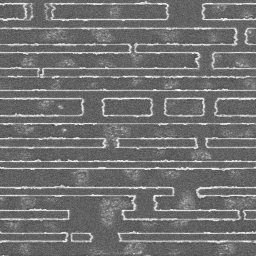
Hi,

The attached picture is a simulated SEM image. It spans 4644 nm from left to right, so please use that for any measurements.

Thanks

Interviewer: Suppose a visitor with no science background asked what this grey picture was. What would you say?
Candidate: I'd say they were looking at parallel lines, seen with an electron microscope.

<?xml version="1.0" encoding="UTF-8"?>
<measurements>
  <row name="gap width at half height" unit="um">0.261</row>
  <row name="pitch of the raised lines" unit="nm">430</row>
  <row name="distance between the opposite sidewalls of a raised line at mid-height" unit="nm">168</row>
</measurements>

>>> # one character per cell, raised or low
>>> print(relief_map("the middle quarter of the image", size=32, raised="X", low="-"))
--------------------------------
XXXXXXXXXXXXXXXXXXXXXXXXXXXXXXXX
XXXXXXXXXXXXXXXXXXXXXXXXXXXXXXXX
--------------------------------
--------------------------------
--------------------------------
---------XX-----------X----XX-X-
XXXXXXXXXXXXXXXXXXXXXXXXXXXXXXXX
XXXXXXXXXXXXXXXXXXXXXXXXXXXXXXXX
-----XXXXX------------XXX-------
-----XXXXX------------XXX-------
-----XXXXX------------XXX-------
----XXXXXX------------XXX-------
XXXXXXXXXXXXXXXXXXXXXXXXXXXXXXXX
XXXXXXXXXXXXXXXXXXXXXXXXXXXXXXXX
--------------------------------
--------------------------------
--------------------------------
--XX----------------------------
XXXXXXXXXX---XXXXXXXXXXXXXXXXXXX
XXXXXXXXXX---XXXXXXXXXXXXXXXXXXX
--------------------------------
--------------------------------
--------------------------------
XXXXXXXXXXXXXXXXXXXXXXXXXXXXXXXX
XXXXXXXXXXXXXXXXXXXXXXXXXXXXXXXX
--------------------------------
--------------------------------
--------------------------------
--------------------------------
--------------------------------
XXXXXXXXXXXXXXXXXXXXXXXXXXX-----